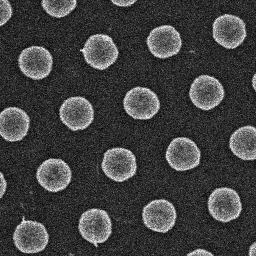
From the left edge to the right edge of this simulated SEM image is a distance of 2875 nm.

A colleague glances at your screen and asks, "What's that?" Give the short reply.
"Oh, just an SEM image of a regular array of raised bodies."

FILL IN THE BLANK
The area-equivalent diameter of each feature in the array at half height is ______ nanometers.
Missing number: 374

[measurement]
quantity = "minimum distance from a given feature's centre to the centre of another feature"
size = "0.731 um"